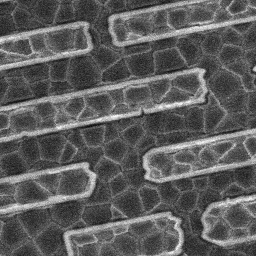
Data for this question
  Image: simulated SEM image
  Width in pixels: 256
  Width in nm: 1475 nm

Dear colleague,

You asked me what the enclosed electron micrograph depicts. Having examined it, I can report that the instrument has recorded one or a few lines or trenches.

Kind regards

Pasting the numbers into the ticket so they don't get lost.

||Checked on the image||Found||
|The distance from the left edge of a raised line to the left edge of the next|402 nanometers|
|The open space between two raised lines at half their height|227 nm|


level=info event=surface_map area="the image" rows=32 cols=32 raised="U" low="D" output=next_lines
DDDDDDDDDDDDDDDDDDDDDDUUUUUUUUUU
DDDDDDDDDDDDDDDDDUUUUUUUUUUUUUUU
DDDDDDDDDDDDDDUUUUUUUUUUUUUUUUUD
DDDDDDDUUUUDDDUUUUUUUUUUUUDDDDDD
DDUUUUUUUUUDDDUUUUUUUDDDDDDDDDDD
UUUUUUUUUUUDDDDUDDDDDDDDDDDDDDDD
UUUUUUUUUUUDDDDDDDDDDDDDDDDDDDDD
UUUUUUDDDDDDDDDDDDDDDDDDDDDDDDDD
DDDDDDDDDDDDDDDDDDDDDDDDDDDDDDDD
DDDDDDDDDDDDDDDDDDDDDUUUUDDDDDDD
DDDDDDDDDDDDDDDDUUUUUUUUUDDDDDDD
DDDDDDDDDDDUUUUUUUUUUUUUUUDDDDDD
DDDDDDUUUUUUUUUUUUUUUUUUUDDDDDDD
DUUUUUUUUUUUUUUUUUUUDDDDDDDDDDDD
UUUUUUUUUUUUUUUDDDDDDDDDDDDDDDDD
UUUUUUUUUUDDDDDDDDDDDDDDDDDDDDDD
UUUUUDDDDDDDDDDDDDDDDDDDDDDDDDDU
UDDDDDDDDDDDDDDDDDDDDDDDDDUUUUUU
DDDDDDDDDDDDDDDDDDDDDUUUUUUUUUUU
DDDDDDDDDDDDDDDDDDUUUUUUUUUUUUUU
DDDDDDDDDDDDDDDDDDUUUUUUUUUUUUUD
DDDDDDUUUUUDDDDDDDUUUUUUUUDDDDDD
DUUUUUUUUUUUDDDDDDDUUDDDDDDDDDDD
UUUUUUUUUUUDDDDDDDDDDDDDDDDDDDDD
UUUUUUUUUUDDDDDDDDDDDDDDDDDDDDDD
UUUUUDDDDDDDDDDDDDDDDDDDDDDUUUUU
DDDDDDDDDDDDDDDDDDDDDDDDDDUUUUUU
DDDDDDDDDDDDDDDDDUUUUUDDDUUUUUUU
DDDDDDDDDDDDUUUUUUUUUUDDDDUUUUUU
DDDDDDDDUUUUUUUUUUUUUUUDDDUUUUUU
DDDDDDDDUUUUUUUUUUUUUUUDDDDDDDDD
DDDDDDDDDUUUUUUUUUUUUUDDDDDDDDDD